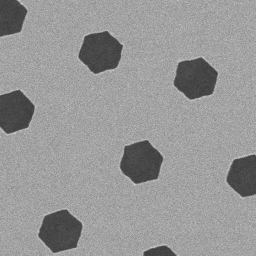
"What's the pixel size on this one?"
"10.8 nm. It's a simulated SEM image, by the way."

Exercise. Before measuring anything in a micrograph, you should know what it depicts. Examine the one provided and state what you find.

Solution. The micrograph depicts holes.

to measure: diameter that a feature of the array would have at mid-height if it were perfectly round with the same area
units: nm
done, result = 449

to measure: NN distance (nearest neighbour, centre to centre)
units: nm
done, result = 1070